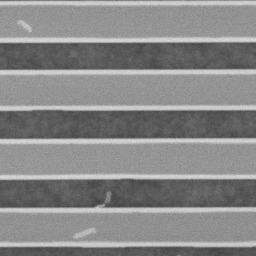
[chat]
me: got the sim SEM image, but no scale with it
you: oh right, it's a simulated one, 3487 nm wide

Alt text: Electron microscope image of one or a few lines or trenches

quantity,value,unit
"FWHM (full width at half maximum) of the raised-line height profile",477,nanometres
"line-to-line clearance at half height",33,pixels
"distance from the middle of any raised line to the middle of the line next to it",934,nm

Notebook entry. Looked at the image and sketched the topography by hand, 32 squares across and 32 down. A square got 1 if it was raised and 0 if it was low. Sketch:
11111111111111100000111111111111
11111111111111111111111111111111
11111111111111111111111111111111
11111111111111111111111111111111
11111111111111111111111111111111
00000000000000000000000000000000
00000000000000000000000000000000
00000000000000000000000000000000
00000000000000000000000000000000
11111111111111111111111111111111
11111111111111111111111111111111
11111111111111111111111111111111
11111111111111111111111111111111
11100000001111111100000000000000
00000000000000000000000000000000
00000000000000000000000000000000
00000000000000000000000000000000
00000000000000000000000000000000
11111111111111111111111111111111
11111111111111111111111111111111
11111111111111111111111111111111
11111111111111111111111111111111
00000000000000000000000000000000
00000000000000000000000000000000
00000000000000000000000000000000
00000000000000000000000000000000
11111111111111111111111111111111
11111111111111111111111111111111
11111111111111111111111111111111
11111111111111111111111111111111
11111111111111111111100000000000
00000000000000000000000000000000